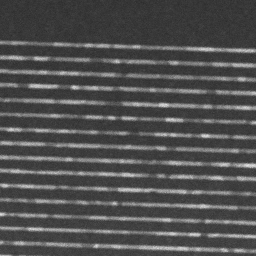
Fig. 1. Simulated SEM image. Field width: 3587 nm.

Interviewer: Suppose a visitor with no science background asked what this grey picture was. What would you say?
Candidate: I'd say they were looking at parallel lines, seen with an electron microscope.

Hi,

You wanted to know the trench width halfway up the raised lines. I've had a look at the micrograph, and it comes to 163 nanometers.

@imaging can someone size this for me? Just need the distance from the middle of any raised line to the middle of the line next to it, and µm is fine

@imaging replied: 0.2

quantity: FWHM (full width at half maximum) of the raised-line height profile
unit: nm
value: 36.8